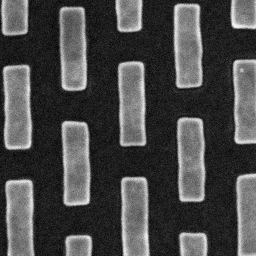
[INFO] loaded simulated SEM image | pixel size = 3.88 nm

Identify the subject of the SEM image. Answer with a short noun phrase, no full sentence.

groups of lines, slits or small figures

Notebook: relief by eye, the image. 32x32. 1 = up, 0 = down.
11100000000000011100000000000111
11100000110000011100001110000111
11100001111000011100001110000111
11100000111000011000001110000000
00000000111000000000001110000000
00000000111000000000001110000000
00000000111000000000001110000000
00000000111000000000001110000000
01110000111000011100001110000111
01110000111000011100001110000111
01110000111000011100001110000111
01110000000000011100000000000111
01110000000000011100000000000111
01110000000000011100000000000111
01110000000000011100000000000111
01110000111000011100001110000111
01110000111000011100001110000111
01110000111000011100001111000111
01100000111000000000001111000000
00000000111000000000001110000000
00000000111000000000001110000000
00000000111000000000001111000000
00000000111000011100001111000011
01110000111000011100001110000011
01110000111000011100001110000011
01110000111000011100000000000011
01110000000000011100000000000011
01110000000000011100000000000011
01110000000000011100000000000011
01110000000000011100000111000011
01110000111000011110000111000011
01110000111000011110000111000011